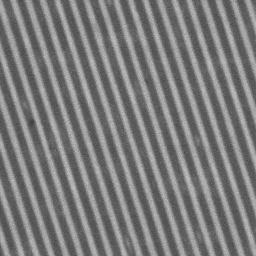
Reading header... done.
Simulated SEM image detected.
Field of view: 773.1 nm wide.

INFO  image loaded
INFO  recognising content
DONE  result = parallel lines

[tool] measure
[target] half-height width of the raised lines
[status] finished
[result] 11.2 nm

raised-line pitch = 42.2 nm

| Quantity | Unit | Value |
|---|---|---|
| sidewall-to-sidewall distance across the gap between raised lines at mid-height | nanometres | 30.3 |